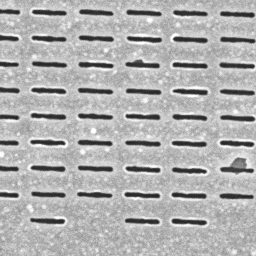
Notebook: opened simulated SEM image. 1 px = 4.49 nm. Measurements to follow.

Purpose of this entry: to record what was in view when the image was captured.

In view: a regular array of holes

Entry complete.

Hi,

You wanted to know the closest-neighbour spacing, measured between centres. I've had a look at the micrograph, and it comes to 0.116 um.